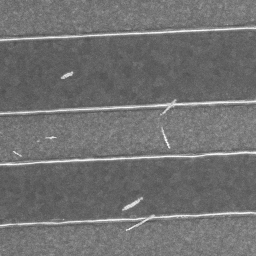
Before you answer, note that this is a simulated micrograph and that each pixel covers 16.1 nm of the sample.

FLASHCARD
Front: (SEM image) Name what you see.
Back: one or a few lines or trenches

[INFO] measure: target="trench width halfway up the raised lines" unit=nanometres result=821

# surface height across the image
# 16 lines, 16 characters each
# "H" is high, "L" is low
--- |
LLLLLLLLLLLLLLLL
LLLLLLLLLLLLLLLL
HHHHHHHHHHHHHHHH
HHHHHHHHHHHHHHHH
HHHHHHHHHHHHHHHH
HHHHHHHHHHHHHHHH
HHHHHHHHHHHLLLLL
LLLLLLLLLLLLLLLL
LLLLLLLLLLLLLLLL
LLLLLLLLLLLLLLLL
HHHHHHHHHHHHHHHH
HHHHHHHHHHHHHHHH
HHHHHHHHHHHHHHHH
HHHHHHHHHHHLLLLL
LLLLLLLLLLLLLLLL
LLLLLLLLLLLLLLLL